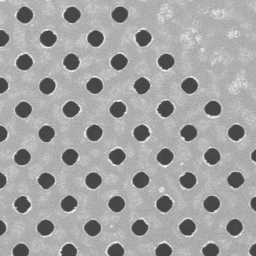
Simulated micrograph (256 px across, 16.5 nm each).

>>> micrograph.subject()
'a regular array of holes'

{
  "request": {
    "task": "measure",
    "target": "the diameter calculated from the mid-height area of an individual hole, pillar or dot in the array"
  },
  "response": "272 nm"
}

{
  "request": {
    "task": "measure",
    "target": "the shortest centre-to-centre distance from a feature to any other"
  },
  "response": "545 nanometers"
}